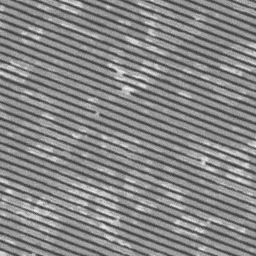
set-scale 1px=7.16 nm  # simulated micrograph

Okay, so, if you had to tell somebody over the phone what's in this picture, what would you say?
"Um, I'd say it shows parallel lines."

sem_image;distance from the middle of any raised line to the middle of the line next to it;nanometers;55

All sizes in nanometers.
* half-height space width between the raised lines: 20.1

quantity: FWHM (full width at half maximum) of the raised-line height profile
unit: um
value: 0.0344